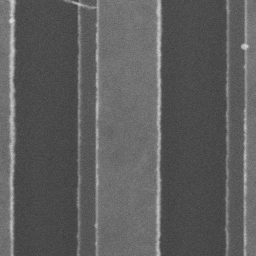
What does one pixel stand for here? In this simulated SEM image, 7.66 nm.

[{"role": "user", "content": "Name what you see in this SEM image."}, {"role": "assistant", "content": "lines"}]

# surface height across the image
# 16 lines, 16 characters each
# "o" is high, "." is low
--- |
o....ooooo....oo
o....ooooo....oo
o....ooooo....oo
o....ooooo....oo
o....ooooo....oo
o....ooooo....oo
o....ooooo....oo
o....ooooo....oo
o....ooooo....oo
o....ooooo....oo
o....ooooo....oo
o....ooooo....oo
o....ooooo....oo
o....ooooo....oo
o....ooooo....oo
o....ooooo....oo